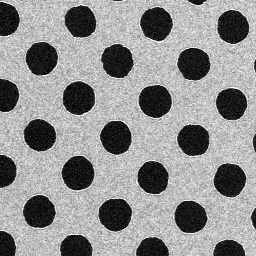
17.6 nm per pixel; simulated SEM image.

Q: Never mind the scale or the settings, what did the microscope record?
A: a regular array of holes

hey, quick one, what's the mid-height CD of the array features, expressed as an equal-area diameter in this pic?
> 0.586 µm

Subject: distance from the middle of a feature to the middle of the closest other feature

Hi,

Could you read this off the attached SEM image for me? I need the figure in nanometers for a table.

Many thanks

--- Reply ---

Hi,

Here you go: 941